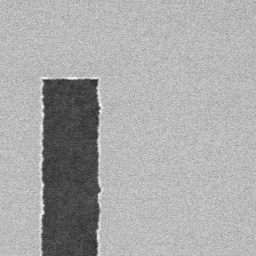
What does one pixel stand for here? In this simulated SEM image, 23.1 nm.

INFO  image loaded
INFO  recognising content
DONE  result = one or a few lines or trenches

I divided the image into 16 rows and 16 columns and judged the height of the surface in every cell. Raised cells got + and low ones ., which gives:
++++++++++++++++
++++++++++++++++
++++++++++++++++
++++++++++++++++
++++++++++++++++
+++...++++++++++
+++...++++++++++
+++...++++++++++
+++...++++++++++
+++...++++++++++
+++...++++++++++
+++...++++++++++
+++...++++++++++
+++...++++++++++
+++...++++++++++
+++...++++++++++